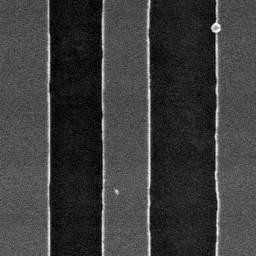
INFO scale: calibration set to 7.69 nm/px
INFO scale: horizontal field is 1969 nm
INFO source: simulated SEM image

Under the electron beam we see lines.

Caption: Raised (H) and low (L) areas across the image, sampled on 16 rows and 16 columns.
HHHLLLHHHLLLLLHH
HHHLLLHHHLLLLHHH
HHHLLLHHHLLLLLHH
HHHLLLHHHLLLLLHH
HHHLLLHHHLLLLLHH
HHHLLLHHHLLLLLHH
HHHLLLHHHLLLLLHH
HHHLLLHHHLLLLLHH
HHHLLLHHHLLLLHHH
HHHLLLHHHLLLLLHH
HHHLLLHHHLLLLHHH
HHHLLLHHHLLLLHHH
HHHLLLHHHLLLLLHH
HHHLLLHHHLLLLLHH
HHHLLLHHHLLLLLHH
HHHLLLHHHLLLLLHH